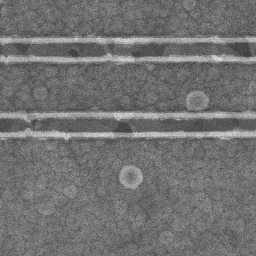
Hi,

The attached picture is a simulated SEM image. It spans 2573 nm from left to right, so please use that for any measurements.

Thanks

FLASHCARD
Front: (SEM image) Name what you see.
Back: one or a few lines or trenches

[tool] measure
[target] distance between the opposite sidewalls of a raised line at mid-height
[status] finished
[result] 20.4 px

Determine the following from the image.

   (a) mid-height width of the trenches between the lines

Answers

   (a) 554 nanometres